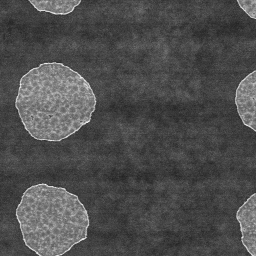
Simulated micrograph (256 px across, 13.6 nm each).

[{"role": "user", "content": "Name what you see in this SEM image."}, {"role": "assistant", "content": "raised bodies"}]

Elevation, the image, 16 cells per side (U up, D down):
DDUUUDDDDDDDDDDU
DDDDDDDDDDDDDDDD
DDDDDDDDDDDDDDDD
DDDDDDDDDDDDDDDD
DDUUUDDDDDDDDDDD
DUUUUUDDDDDDDDDU
DUUUUUDDDDDDDDDU
DUUUUDDDDDDDDDDU
DDUUDDDDDDDDDDDD
DDDDDDDDDDDDDDDD
DDDDDDDDDDDDDDDD
DDDDDDDDDDDDDDDD
DUUUUDDDDDDDDDDD
DUUUUDDDDDDDDDDU
DUUUUDDDDDDDDDDU
DDUUDDDDDDDDDDDU